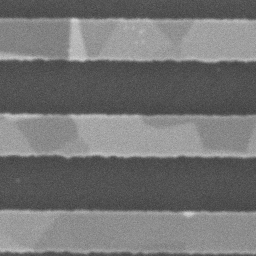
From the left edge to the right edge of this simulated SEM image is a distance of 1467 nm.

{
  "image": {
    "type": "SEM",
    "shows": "lines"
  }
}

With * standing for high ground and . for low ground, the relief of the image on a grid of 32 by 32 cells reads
................................
................................
***************************.***.
********************************
********************************
********************************
********************************
..........*.....***.*.*.****.***
................................
................................
................................
................................
................................
................................
******************.********..***
********************************
********************************
********************************
********************************
........*....*.*******...***.***
................................
................................
................................
................................
................................
................................
********************.....*......
********************************
********************************
********************************
********************************
..*......**..*..****.***********